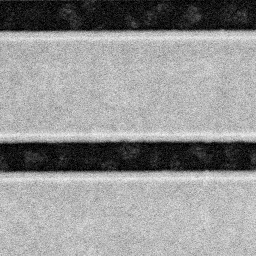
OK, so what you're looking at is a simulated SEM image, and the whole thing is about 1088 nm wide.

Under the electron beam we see one or a few lines or trenches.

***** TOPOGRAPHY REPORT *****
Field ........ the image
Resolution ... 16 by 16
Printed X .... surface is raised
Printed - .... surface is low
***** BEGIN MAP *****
----------------
----------------
XXXXXXXXXXXXXXXX
XXXXXXXXXXXXXXXX
XXXXXXXXXXXXXXXX
XXXXXXXXXXXXXXXX
XXXXXXXXXXXXXXXX
XXXXXXXXXXXXXXXX
XXXXXXXXXXXXXXXX
----------------
----------------
XXXXXXXXXXXXXXXX
XXXXXXXXXXXXXXXX
XXXXXXXXXXXXXXXX
XXXXXXXXXXXXXXXX
XXXXXXXXXXXXXXXX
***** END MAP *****